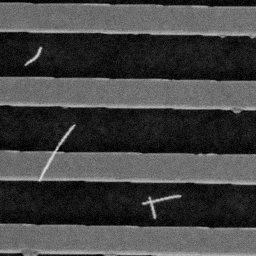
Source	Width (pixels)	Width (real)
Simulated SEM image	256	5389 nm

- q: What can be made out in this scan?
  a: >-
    lines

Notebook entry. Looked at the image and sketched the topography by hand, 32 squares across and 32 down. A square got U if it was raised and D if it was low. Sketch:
UUUUDDDDDDDDDDDDDDDDDDDDDDDDDDDD
UUUUUUUUUUUUUUUUUUUUUUUUUUUUUUUU
UUUUUUUUUUUUUUUUUUUUUUUUUUUUUUUU
UUUUUUUUUUUUUUUUUUUUUUUUUUUUUUUU
DDDDDDDDDDDDDDDDDDDDDDDDDDDDDDDD
DDDDDDDDDDDDDDDDDDDDDDDDDDDDDDDD
DDDDDDDDDDDDDDDDDDDDDDDDDDDDDDDD
DDDDDDDDDDDDDDDDDDDDDDDDDDDDDDDD
DDDDDDDDDDDDDDDDDDDDDDDDDDDDDDDD
DDDDDDDDDDDDDDDDDDDDDDDDDDDDDDDD
UUUUUUUUUUUUUUUUUUUUUUUUUUUUUUUU
UUUUUUUUUUUUUUUUUUUUUUUUUUUUUUUU
UUUUUUUUUUUUUUUUUUUUUUUUUUUUUUUU
DDDDDDDDDDDDDDDDDDDDDDDDUUUUUUUU
DDDDDDDDDDDDDDDDDDDDDDDDDDDDDDDD
DDDDDDDDDDDDDDDDDDDDDDDDDDDDDDDD
DDDDDDDDDDDDDDDDDDDDDDDDDDDDDDDD
DDDDDDDDDDDDDDDDDDDDDDDDDDDDDDDD
DDDDDDDDDDDDDDDDDDDDDDDDDDDDDDDD
UUUUUUUUUUUUUUUUUUUUUUUUUUUUUUUU
UUUUUUUUUUUUUUUUUUUUUUUUUUUUUUUU
UUUUUUUUUUUUUUUUUUUUUUUUUUUUUUUU
DDDDUUDDDDDDDDUUUUUUUUUUUUUUUUUU
DDDDDDDDDDDDDDDDDDDDDDDDDDDDDDDD
DDDDDDDDDDDDDDDDDDDDDDDDDDDDDDDD
DDDDDDDDDDDDDDDDDDDDDDDDDDDDDDDD
DDDDDDDDDDDDDDDDDDDDDDDDDDDDDDDD
DDDDDDDDDDDDDDDDDDDDDDDDDDDDDDDD
UUUUUUUUUUUUUUUUUUUUUUUUUUDDDDDD
UUUUUUUUUUUUUUUUUUUUUUUUUUUUUUUU
UUUUUUUUUUUUUUUUUUUUUUUUUUUUUUUU
DDDUUUUUUUUUUUUUUUUUUUUUUUUUUUUU